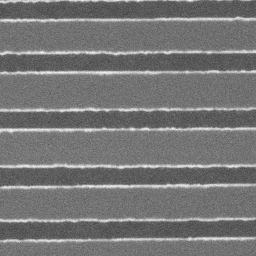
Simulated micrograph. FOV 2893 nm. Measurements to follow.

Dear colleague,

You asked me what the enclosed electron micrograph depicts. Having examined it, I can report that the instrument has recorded lines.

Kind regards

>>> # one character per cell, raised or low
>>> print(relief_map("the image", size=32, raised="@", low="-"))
--------------------------------
--------------------------------
@@@@@@@@@@@@@@@@@@@@@@@@@@@@@@@@
@@@@@@@@@@@@@@@@@@@@@@@@@@@@@@@@
@@@@@@@@@@@@@@@@@@@@@@@@@@@@@@@@
@@@@@@@@@@@@@@@@@@@@@@@@@@@@@@@@
@@@@@@@@@@@@@@@@@@@@@@@@@@@@@@@@
--------------------------------
--------------------------------
@@@@@@@@@@@@@@@@@@@@@@@@@@@@@@@@
@@@@@@@@@@@@@@@@@@@@@@@@@@@@@@@@
@@@@@@@@@@@@@@@@@@@@@@@@@@@@@@@@
@@@@@@@@@@@@@@@@@@@@@@@@@@@@@@@@
@@@@@@@@@@@@@@@@@@@@@@@@@@@@@@@@
--------------------------------
--------------------------------
@@@@@@@@@@@@@@@@@@@@@@@@@@@@@@@@
@@@@@@@@@@@@@@@@@@@@@@@@@@@@@@@@
@@@@@@@@@@@@@@@@@@@@@@@@@@@@@@@@
@@@@@@@@@@@@@@@@@@@@@@@@@@@@@@@@
@@@@@@@@@@@@@@@@@@@@@@@@@@@@@@@@
--------------------------------
--------------------------------
@@@@@@@@@@@@@@@@@@@@@@@@@@@@@@@@
@@@@@@@@@@@@@@@@@@@@@@@@@@@@@@@@
@@@@@@@@@@@@@@@@@@@@@@@@@@@@@@@@
@@@@@@@@@@@@@@@@@@@@@@@@@@@@@@@@
@@@@@@@@@@@@@@@@@@@@@@@@-@@@----
--------------------------------
--------------------------------
@@@@@@@@@@@@@@@@@@@@@@@@@@@@@@@@
@@@@@@@@@@@@@@@@@@@@@@@@@@@@@@@@